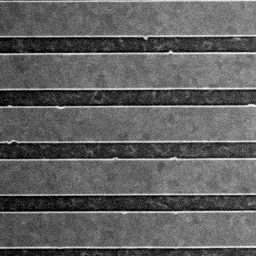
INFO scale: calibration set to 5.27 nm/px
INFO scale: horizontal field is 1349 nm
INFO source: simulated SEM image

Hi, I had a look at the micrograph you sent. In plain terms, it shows parallel lines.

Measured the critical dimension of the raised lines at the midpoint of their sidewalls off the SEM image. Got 187 nanometers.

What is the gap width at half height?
88.9 nanometers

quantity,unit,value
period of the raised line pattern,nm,278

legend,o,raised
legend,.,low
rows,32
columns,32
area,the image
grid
oooooooooooooooooooooooooooooooo
oooooooooooooooooooooooooooooooo
oooooooooooooooooooooooooooooooo
oooooooooooooooooooooooooooooooo
oooooooooooooooooooooooooo......
................................
................................
oooooooooooooooooooooooooooooooo
oooooooooooooooooooooooooooooooo
oooooooooooooooooooooooooooooooo
oooooooooooooooooooooooooooooooo
................................
................................
oooooooooooooooooooooooooooooooo
oooooooooooooooooooooooooooooooo
oooooooooooooooooooooooooooooooo
oooooooooooooooooooooooooooooooo
oooooooooooooooooooooooooooooooo
................................
................................
oooooooooooooooooooooooooooooooo
oooooooooooooooooooooooooooooooo
oooooooooooooooooooooooooooooooo
oooooooooooooooooooooooooooooooo
................................
................................
.............o.................o
oooooooooooooooooooooooooooooooo
oooooooooooooooooooooooooooooooo
oooooooooooooooooooooooooooooooo
oooooooooooooooooooooooooooooooo
................................